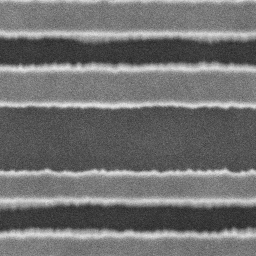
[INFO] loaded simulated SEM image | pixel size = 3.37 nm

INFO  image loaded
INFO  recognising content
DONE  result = lines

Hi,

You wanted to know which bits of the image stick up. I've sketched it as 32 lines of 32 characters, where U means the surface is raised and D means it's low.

UUUUUUUUUUUUUUUUUUUUUUUUUUUUUUUU
UUUUUUUUUUUUUUUUUUUUUUUUUUUUUUUU
UUUUUUUUUUUUUUUUUUUUUUUUUUUUUUUU
UUUUUUUUUUUUUUUUUUUUUUUUUUUUUUUU
DDDDDDDDDDDDDUDDDDDDDDDDDDUDDUUD
DDDDDDDDDDDDDDDDDDDDDDDDDDDDDDDD
DDDDDDDDDDDDDDDDDDDDDDDDDDDDDDDD
DDDDDDDDDDDDDDDDDDDDDDDDDDDDDDDD
UUUUUUUUUUUUUUUUUDUUUUUUUUUUUUUD
UUUUUUUUUUUUUUUUUUUUUUUUUUUUUUUU
UUUUUUUUUUUUUUUUUUUUUUUUUUUUUUUU
UUUUUUUUUUUUUUUUUUUUUUUUUUUUUUUU
UUUUUUUUUUUUUUUUUUUUUUUUUUUUUUUU
DDDDDDDDDDDDDDDDDDDDDDDDDDDDDDDD
DDDDDDDDDDDDDDDDDDDDDDDDDDDDDDDD
DDDDDDDDDDDDDDDDDDDDDDDDDDDDDDDD
DDDDDDDDDDDDDDDDDDDDDDDDDDDDDDDD
DDDDDDDDDDDDDDDDDDDDDDDDDDDDDDDD
DDDDDDDDDDDDDDDDDDDDDDDDDDDDDDDD
DDDDDDDDDDDDDDDDDDDDDDDDDDDDDDDD
DDDDDDDDDDDDDDDDDDDDDDDDDDDDDDDD
UUUUUUUDUDDUUUUUDDDUDUUUUUUUUDUU
UUUUUUUUUUUUUUUUUUUUUUUUUUUUUUUU
UUUUUUUUUUUUUUUUUUUUUUUUUUUUUUUU
UUUUUUUUUUUUUUUUUUUUUUUUUUUUUUUU
DDDDDDDDDDDDDDDDDDDDDDDDDDDDDDDD
DDDDDDDDDDDDDDDDDDDDDDDDDDDDDDDD
DDDDDDDDDDDDDDDDDDDDDDDDDDDDDDDD
DDDDDDDDDDDDDDDDDDDDDDDDDDDDDDDD
UUUUUUUUUUUUUUUUUUUUUUUUUUUUUUUU
UUUUUUUUUUUUUUUUUUUUUUUUUUUUUUUU
UUUUUUUUUUUUUUUUUUUUUUUUUUUUUUUU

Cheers